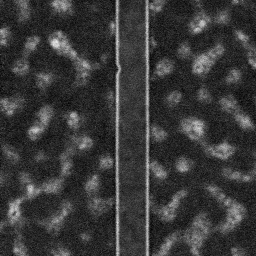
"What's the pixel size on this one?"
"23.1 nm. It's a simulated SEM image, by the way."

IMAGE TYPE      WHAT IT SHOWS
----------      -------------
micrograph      one or a few lines or trenches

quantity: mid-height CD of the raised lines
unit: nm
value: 701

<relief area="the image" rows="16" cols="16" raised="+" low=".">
.......++.......
.......++.......
.......++.......
.......++.......
.......++.......
.......++.......
.......++.......
.......++.......
.......++.......
.......++.......
.......++.......
.......++.......
.......++.......
.......++.......
.......++.......
.......++.......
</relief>